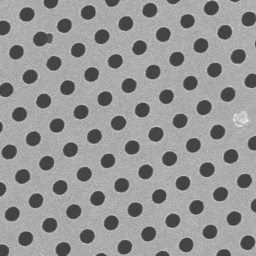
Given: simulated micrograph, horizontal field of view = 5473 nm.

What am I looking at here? a regular array of holes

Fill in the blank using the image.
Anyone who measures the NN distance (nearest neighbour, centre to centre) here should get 583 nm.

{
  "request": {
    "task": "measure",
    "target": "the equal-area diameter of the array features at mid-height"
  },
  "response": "14.9 pixels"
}